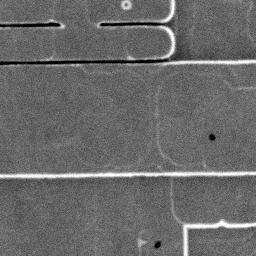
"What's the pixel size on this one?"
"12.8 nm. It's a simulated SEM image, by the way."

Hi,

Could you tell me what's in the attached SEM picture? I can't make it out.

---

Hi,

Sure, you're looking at wiring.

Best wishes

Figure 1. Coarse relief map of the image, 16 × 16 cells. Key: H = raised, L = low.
HHHHHHHHHHHLLLLL
HHHHHHHHHHLLLLLL
HHHHHHHHHHHLLLLL
HHHHHHHHHHHLLLLL
HHHHHHHHHHHHHHHH
HHHHHHHHHHHHHHHH
HHHHHHHHHHHHHHHH
HHHHHHHHHHHHHHHH
HHHHHHHHHHHHHHHH
HHHHHHHHHHHHHHHH
HHHHHHHHHHHHHHHH
LLLLLLLLLLLLLLLL
LLLLLLLLLLLLLLLL
LLLLLLLLLLLLLLLL
LLLLLLLLLLLLLLLL
LLLLLLLLLLLLLLLL